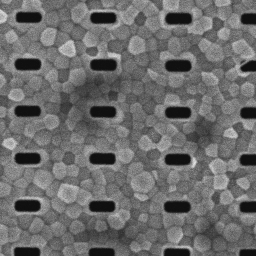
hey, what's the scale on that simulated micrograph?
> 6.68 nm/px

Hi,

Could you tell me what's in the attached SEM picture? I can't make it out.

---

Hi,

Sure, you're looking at a regular array of holes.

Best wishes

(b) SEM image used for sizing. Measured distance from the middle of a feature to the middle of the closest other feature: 0.314 um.